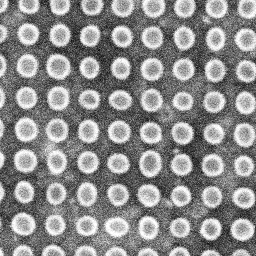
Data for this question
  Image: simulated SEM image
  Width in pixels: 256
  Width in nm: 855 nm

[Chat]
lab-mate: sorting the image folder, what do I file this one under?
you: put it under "a regular array of raised bodies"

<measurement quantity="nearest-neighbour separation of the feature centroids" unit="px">30.9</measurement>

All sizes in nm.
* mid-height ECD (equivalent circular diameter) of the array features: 64.1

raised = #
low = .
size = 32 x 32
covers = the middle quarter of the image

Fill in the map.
#...####....####....####....####
#...#####...####....####....####
#....###.....###....####....####
.....................##......##.
................................
................................
.....................##.........
#....###....####....####.....##.
#...#####...####....####....####
#...#####...#####...####....####
.....###....####....####....####
................................
................................
................................
.....##.........................
#...####....####....###.....###.
#...####...#####...#####...#####
#...####...#####...#####...#####
.....###....####....####...#####
.....................##......#..
................................
................................
.....##.............###.........
....####....####...#####....###.
....####...#####...#####...#####
....####...#####...#####...#####
.....###....####....####...####.
....................###......#..
................................
................................
.....##......#......##..........
....####...####....####.....###.